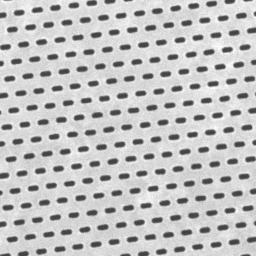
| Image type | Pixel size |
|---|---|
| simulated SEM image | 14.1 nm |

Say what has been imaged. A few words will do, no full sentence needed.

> a regular array of holes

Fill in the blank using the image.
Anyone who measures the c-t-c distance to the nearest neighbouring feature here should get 0.253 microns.